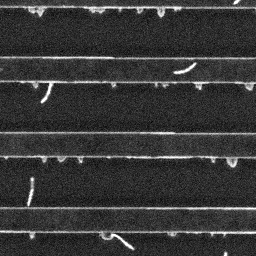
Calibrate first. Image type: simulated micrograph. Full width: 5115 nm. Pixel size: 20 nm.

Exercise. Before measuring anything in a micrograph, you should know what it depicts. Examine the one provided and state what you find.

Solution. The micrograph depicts lines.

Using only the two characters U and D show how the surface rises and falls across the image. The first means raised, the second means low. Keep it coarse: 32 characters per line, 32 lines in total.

UUUUUUUUUUUUUUUUUUUUUUUUUUUUUUUU
DDDDDDDDDDDDDDDDDDDDDDDDDDDDDDDD
DDDDDDDDDDDDDDDDDDDDDDDDDDDDDDDD
DDDDDDDDDDDDDDDDDDDDDDDDDDDDDDDD
DDDDDDDDDDDDDDDDDDDDDDDDDDDDDDDD
DDDDDDDDDDDDDDDDDDDDDDDDDDDDDDDD
DDDDDDDDDDDDDDDDDDDDDDDDDDDDDDDD
UUUUUUUUUUUUUUUUUUUUUUUUUUUUUUUU
UUUUUUUUUUUUUUUUUUUUUUUUUUUUUUUU
UUUUUUUUUUUUUUUUUUUUUUUUUUUUUUUU
DDDDDDDDDDDDDDDDDDDDDDDDDDDDDDUU
DDDDDDDDDDDDDDDDDDDDDDDDDDDDDDDD
DDDDDDDDDDDDDDDDDDDDDDDDDDDDDDDD
DDDDDDDDDDDDDDDDDDDDDDDDDDDDDDDD
DDDDDDDDDDDDDDDDDDDDDDDDDDDDDDDD
DDDDDDDDDDDDDDDDDDDDDDDDDDDDDDDD
DDDDDDDDDDDDDDDDDDDDDDDDDDDDDDDD
UUUUUUUUUUUUUUUUUUUUUUUUUUUUUUUU
UUUUUUUUUUUUUUUUUUUUUUUUUUUUUUUU
UUUUUUUUUUUUUUUUUUUUUUUUUUUUUUUU
DDDDDDDDDDDDDDDDDDDDDDDDDDDDDDDD
DDDDDDDDDDDDDDDDDDDDDDDDDDDDDDDD
DDDDDDDDDDDDDDDDDDDDDDDDDDDDDDDD
DDDDDDDDDDDDDDDDDDDDDDDDDDDDDDDD
DDDDDDDDDDDDDDDDDDDDDDDDDDDDDDDD
DDDDDDDDDDDDDDDDDDDDDDDDDDDDDDDD
UUUUUUUUUUUUUUUUUUUUUUUUUUUUUUUU
UUUUUUUUUUUUUUUUUUUUUUUUUUUUUUUU
UUUUUUUUUUUUUUUUUUUUUUUUUUUUUUUU
DDDDDDDDDDDDDUDDDDDDDDDDDDDDDDDD
DDDDDDDDDDDDDDDDDDDDDDDDDDDDDDDD
DDDDDDDDDDDDDDDDDDDDDDDDDDDDDDDD